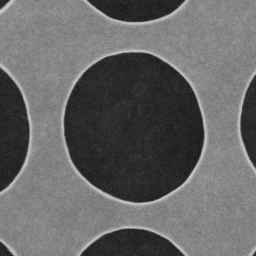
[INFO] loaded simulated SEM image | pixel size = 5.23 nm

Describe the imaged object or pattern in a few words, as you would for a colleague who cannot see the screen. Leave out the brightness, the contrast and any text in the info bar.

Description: holes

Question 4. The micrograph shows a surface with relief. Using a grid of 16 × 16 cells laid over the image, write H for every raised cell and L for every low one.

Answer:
HHHHHHLLLLLHHHHH
HHHHHHHHHHHHHHHH
HHHHHHHHHHHHHHHH
HHHHHHHLLLHHHHHH
HHHHHLLLLLLHHHHH
LHHHHLLLLLLLHHHL
LLHHLLLLLLLLHHHL
LLHHLLLLLLLLLHHL
LLHHLLLLLLLLLHHL
LLHHLLLLLLLLLHHL
LHHHHLLLLLLLHHHH
LHHHHHLLLLLHHHHH
HHHHHHHHLLHHHHHH
HHHHHHHHHHHHHHHH
HHHHHHHLLLHHHHHH
HHHHHLLLLLLHHHHH